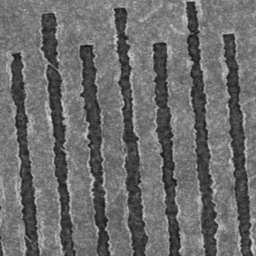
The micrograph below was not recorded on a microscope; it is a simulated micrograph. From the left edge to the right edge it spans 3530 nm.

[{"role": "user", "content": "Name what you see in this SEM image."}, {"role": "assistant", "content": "parallel lines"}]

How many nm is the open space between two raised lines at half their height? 172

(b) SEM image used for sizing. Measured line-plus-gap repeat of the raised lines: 490 nanometers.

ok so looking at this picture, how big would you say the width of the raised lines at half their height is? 318 nm